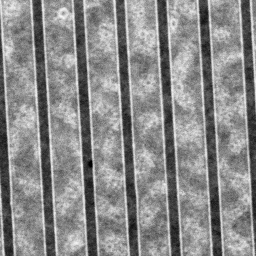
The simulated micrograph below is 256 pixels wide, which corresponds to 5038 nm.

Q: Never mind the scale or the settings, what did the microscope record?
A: parallel lines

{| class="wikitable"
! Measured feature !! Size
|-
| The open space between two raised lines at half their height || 0.216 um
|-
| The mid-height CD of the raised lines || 0.607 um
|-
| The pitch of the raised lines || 41.6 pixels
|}